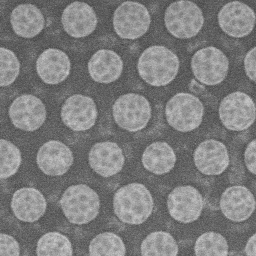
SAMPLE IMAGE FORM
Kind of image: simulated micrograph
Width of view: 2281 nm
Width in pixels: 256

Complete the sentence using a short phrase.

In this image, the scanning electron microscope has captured a regular array of raised bodies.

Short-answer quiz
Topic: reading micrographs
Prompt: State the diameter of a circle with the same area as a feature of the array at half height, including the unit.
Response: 313 nm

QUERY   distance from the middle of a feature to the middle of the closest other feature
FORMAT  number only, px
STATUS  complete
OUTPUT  51.9